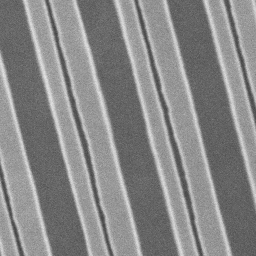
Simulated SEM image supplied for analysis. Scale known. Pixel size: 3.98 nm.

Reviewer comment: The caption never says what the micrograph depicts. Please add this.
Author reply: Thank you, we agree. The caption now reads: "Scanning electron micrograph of lines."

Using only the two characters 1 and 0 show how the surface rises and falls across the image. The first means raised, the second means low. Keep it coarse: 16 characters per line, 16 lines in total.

0011100111000111
0011100011100111
0011100011100111
0011110011100011
0001110011100011
0001110001110011
1001110001110001
1001111001110001
1000111001111001
1100111000111001
1100111000111000
1100111100111000
1100011100111000
1110011100011100
1110011100011100
1110001110011100